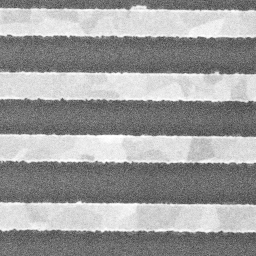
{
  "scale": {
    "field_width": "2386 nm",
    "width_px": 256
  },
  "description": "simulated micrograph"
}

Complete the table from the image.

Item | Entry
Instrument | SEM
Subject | lines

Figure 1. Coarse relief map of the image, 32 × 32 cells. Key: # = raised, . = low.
................................
################################
################################
################################
.................#.#.###########
................................
................................
................................
................................
################################
################################
################################
...................#.###########
................................
................................
................................
................................
################################
################################
################################
................................
................................
................................
................................
................................
###.##..........................
################################
################################
################################
................................
................................
................................